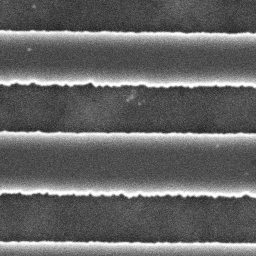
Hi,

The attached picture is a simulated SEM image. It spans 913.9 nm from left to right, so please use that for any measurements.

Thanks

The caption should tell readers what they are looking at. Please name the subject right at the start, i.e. lines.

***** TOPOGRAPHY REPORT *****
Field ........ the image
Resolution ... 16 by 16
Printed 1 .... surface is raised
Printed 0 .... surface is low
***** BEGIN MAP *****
0000000000000000
0000000000000000
1111111111111111
1111111111111111
1111111111111111
0000000000000000
0000000000000000
0000000000000000
1111111111111111
1111111111111111
1111111111111111
1111111111111111
0000000000000000
0000000000000000
0000000000000000
1111111111111111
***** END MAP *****